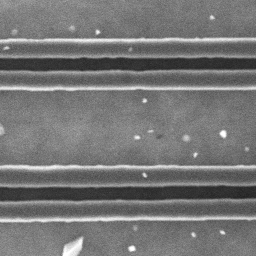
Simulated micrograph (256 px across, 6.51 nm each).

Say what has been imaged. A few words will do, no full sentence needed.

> lines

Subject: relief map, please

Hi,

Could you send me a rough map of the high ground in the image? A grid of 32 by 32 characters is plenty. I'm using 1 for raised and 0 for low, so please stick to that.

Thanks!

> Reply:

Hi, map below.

00000000000000000000000000000000
00000000000000000000000000000000
00000000000000000000000000000000
00000000000000000000000000000000
00000000000000000000000000000000
11111111111111111111111111111111
11111111111111111111111111111111
00000000000000000000000000000000
00000000000000000000000000000000
11111111111111111111111111111111
11111111111111111111111111111111
00000000000000000000000000000000
00000000000000000000000000000000
00000000000000000000000000000000
00000000000000000000000000000000
00000000000000000000000000000000
00000000000000000000000000000000
00000000000000000000000000000000
00000000000000000000000000000000
00000000000000000000000000000000
00000000000000000000000000000000
11111111111111111111111111111111
11111111111111111111111111111111
00000000000000000000000000000000
00000000000000000000000000000000
11111111111111111111111111111111
11111111111111111111111111111111
11111111111000000000000000000000
00000000000000000000000000000000
00000000000000000000000000000000
00000000000000000000000000000000
00000000000000000000000000000000